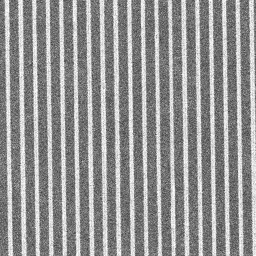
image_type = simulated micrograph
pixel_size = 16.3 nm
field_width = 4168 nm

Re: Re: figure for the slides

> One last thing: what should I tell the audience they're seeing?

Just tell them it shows parallel lines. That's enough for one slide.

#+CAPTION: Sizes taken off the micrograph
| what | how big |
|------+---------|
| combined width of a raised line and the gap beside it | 221 nm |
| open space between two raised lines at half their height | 187 nm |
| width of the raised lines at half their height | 46.8 nm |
